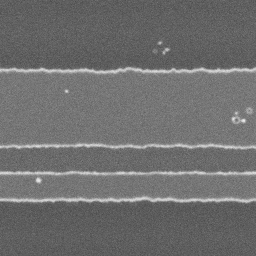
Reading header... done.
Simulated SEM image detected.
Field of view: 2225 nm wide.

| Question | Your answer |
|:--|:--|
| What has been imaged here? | lines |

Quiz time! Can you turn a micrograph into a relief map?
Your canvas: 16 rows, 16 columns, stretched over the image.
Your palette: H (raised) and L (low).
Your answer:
LLLLLLLLLLLLLLLL
LLLLLLLLLLLLLLLL
LLLLLLLLLLLLLLLL
LLLLLLLLLLLLLLLL
HHHHHHHHHHHHHHHH
HHHHHHHHHHHHHHHH
HHHHHHHHHHHHHHHH
HHHHHHHHHHHHHHHH
HHHHHHHHHHHHHHHH
HHHHHHHHHHHHHHHH
HHHHHHHHHHHHHHHH
HHHHHHHHHHHHHHHH
HHHHHHHHLLLHHHHH
LLLLLLLLLLLLLLLL
LLLLLLLLLLLLLLLL
LLLLLLLLLLLLLLLL